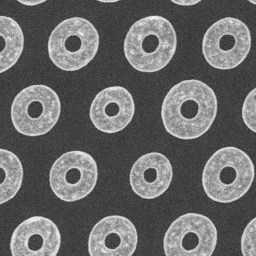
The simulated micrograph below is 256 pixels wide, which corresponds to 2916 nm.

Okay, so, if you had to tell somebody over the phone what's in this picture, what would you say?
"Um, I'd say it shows a regular array of ring-shaped raised bodies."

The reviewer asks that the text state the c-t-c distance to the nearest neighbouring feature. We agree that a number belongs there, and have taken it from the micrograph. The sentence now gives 864 nanometres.